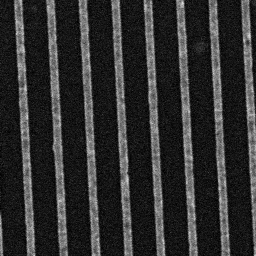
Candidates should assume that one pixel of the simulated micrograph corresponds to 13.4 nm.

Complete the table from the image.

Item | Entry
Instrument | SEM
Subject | parallel lines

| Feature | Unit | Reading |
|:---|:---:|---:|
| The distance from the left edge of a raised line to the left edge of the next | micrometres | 0.432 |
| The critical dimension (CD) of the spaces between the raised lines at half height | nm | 340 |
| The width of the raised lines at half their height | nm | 91.7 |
